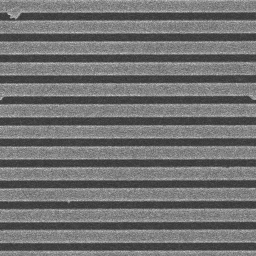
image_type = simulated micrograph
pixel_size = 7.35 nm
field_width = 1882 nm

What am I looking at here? parallel lines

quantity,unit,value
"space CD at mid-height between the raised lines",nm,58.8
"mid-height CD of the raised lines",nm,92.8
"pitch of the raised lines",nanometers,154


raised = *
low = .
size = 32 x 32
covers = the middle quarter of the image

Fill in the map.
********************************
********************************
********************************
................................
................................
********************************
********************************
********************************
................................
................................
********************************
********************************
********************************
................................
................................
**********....******************
********************************
********************************
***********.....................
................................
................................
********************************
********************************
********************************
................................
................................
********************************
********************************
********************************
................................
................................
********************************